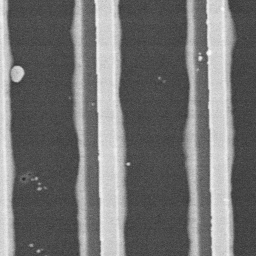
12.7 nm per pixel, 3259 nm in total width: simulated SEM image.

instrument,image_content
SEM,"lines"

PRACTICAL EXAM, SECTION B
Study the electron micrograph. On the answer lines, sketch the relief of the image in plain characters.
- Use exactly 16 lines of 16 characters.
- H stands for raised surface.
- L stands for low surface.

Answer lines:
LLLLLHHLLLLLHHLL
LLLLLHHLLLLLHHLL
LLLLLHHLLLLLHHLL
LLLLLHHLLLLLHHLL
LLLLLHHLLLLLHHLL
LLLLLHHLLLLLHHLL
LLLLLHHLLLLLHHLL
LLLLLHHLLLLLHHLL
LLLLLHHLLLLLHHLL
LLLLLHHLLLLLHHLL
LLLLLHHLLLLLHHLL
LLLLLHHLLLLLHHLL
LLLLLHHLLLLLHHLL
HLLLLHHLLLLLHHLL
HLLLLHHLLLLLHHLL
HLLLLHHLLLLLHHLL